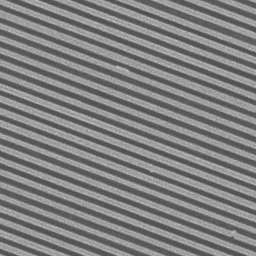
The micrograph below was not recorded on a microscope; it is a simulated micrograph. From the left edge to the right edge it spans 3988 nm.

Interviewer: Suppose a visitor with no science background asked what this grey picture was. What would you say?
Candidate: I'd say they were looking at parallel lines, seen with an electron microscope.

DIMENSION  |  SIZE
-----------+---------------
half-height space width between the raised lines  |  87.6 nm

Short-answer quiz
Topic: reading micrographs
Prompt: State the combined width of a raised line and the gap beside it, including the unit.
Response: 178 nm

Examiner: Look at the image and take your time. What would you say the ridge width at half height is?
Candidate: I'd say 89.4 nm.